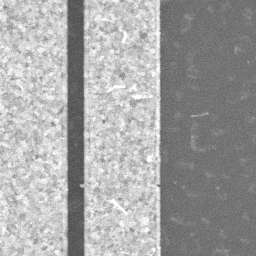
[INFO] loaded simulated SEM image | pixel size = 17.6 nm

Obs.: one or a few lines or trenches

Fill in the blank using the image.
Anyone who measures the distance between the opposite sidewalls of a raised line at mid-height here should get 1250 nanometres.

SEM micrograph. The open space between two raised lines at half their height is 378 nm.